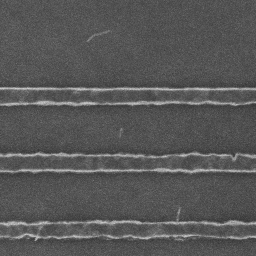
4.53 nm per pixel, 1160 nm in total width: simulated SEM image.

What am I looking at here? one or a few lines or trenches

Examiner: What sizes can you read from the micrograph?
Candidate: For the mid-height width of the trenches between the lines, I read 234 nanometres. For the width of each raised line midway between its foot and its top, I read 0.0656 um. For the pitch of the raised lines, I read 66.8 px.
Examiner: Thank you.